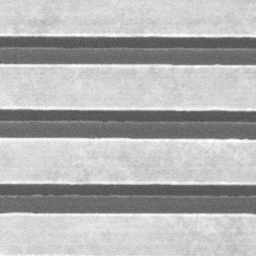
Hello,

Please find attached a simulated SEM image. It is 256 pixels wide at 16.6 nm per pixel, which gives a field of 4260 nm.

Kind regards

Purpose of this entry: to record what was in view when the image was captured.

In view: lines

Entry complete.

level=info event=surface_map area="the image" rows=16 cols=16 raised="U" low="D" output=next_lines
UUUUUUUUUUUUUUUU
UUUUUUUUUUUUUUUU
DDDDDDDDDDDDDDDD
DDDDDDDDDDDDDDDD
UUUUUUUUUUUUUUUU
UUUUUUUUUUUUUUUU
UUUUUUUUUUUUUUUU
DDDDDDDDDDDDDDDD
DDDDDDDDDDDDDDDD
UUUUUUUUUUUUUUUU
UUUUUUUUUUUUUUUU
DDDDDDDDDDDDDDDD
DDDDDDDDDDDDDDDD
UUUUUUUUUUUUUUUU
UUUUUUUUUUUUUUUU
UUUUUUUUUUUUUUUU